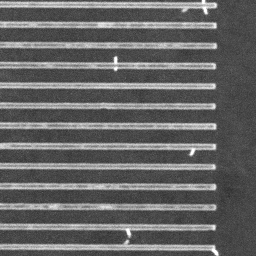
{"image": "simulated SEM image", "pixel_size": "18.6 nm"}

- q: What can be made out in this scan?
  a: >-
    parallel lines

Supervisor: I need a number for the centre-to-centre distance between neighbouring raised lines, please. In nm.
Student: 377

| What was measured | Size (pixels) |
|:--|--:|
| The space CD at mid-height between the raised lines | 15.6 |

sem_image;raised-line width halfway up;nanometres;90.9